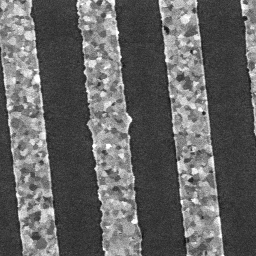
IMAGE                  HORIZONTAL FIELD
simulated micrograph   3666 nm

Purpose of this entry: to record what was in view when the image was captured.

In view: one or a few lines or trenches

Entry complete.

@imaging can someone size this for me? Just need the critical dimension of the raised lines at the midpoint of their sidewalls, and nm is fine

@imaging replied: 496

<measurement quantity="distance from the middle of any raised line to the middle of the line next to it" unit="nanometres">1170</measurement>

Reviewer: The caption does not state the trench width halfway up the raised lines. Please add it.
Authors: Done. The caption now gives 667 nm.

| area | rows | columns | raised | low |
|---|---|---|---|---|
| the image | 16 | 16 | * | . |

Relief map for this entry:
**...**...**...*
**...**...**...*
**...**...**...*
**...**...***..*
**...***...**...
**...***...**...
***...**...**...
.**...**...**...
.**...**...**...
.**...**...**...
.**...**...**...
.**...**...**...
.**...**...***..
.**...***..***..
.**...***...**..
.***...**...**..